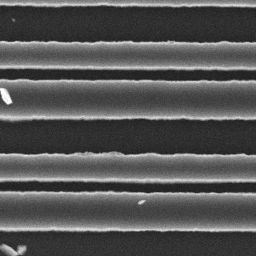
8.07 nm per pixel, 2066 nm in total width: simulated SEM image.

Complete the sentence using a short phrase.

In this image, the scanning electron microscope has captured lines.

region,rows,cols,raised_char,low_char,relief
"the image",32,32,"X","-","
XXXXXXXXXXXXXXXXXXXXXXXXXXXXXXXX
--------------------------------
--------------------------------
--------------------------------
--------------------------------
XXXXXXXXXXXXXXXXXXXXXXXXXXXXXXXX
XXXXXXXXXXXXXXXXXXXXXXXXXXXXXXXX
XXXXXXXXXXXXXXXXXXXXXXXXXXXXXXXX
XXXXXXXXXXXXXXXXXXXXXXXXXXXXXXXX
XXXXXXXXXXXXXXXXXXXXXXXXXXXXXXXX
XXXXXXXXXXXXXXXXXXXXXXXXXXXXXXXX
XXXXXXXXXXXXXXXXXXXXXXXXXXXXXXXX
XXXXXXXXXXXXXXXXXXXXXXXXXXXXXXXX
XXXXXXXXXXXXXXXXXXXXXXXXXXXXXXXX
XXXXXXXXXXXXXXXXXXXXXXXXXXXXXXXX
--------------------------------
--------------------------------
--------------------------------
--------------------------------
XXXXXXXXXXXXXXXXXXXX-XXXXXXXXXX-
XXXXXXXXXXXXXXXXXXXXXXXXXXXXXXXX
XXXXXXXXXXXXXXXXXXXXXXXXXXXXXXXX
XXXXXXXXXXXXXXXXXXXXXXXXXXXXXXXX
XXXXXXXXXXXXXXXXXXXXXXXXXXXXXXXX
XXXXXXXXXXXXXXXXXXXXXXXXXXXXXXXX
XXXXXXXXXXXXXXXXXXXXXXXXXXXXXXXX
XXXXXXXXXXXXXXXXXXXXXXXXXXXXXXXX
XXXXXXXXXXXXXXXXXXXXXXXXXXXXXXXX
XXXXXXXXXXXXXXXXXXXXXXXXXXXXXXXX
--------------------------------
--------------------------------
--------------------------------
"